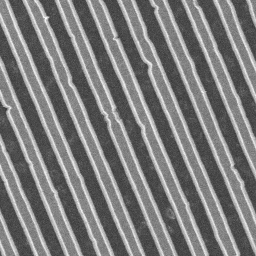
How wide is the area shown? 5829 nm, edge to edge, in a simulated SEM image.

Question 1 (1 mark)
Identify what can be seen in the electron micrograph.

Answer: parallel lines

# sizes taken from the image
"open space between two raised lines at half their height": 384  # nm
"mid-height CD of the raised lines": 271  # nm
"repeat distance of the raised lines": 666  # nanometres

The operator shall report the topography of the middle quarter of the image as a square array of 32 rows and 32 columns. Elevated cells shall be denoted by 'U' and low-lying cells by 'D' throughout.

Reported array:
DDDDDUUUDDDDDUUUDDDDDDUUDDDDDUUU
UDDDDUUUDDDDDUUUUDDDDDUUDDDDDUUU
UDDDDDUUUDDDDDUUUDDDDDUUUDDDDUUU
UDDDDDUUUDDDDDUUUDDDDDUUUDDDDDUU
UUDDDDDUUUDDDDDUUUDDDDUUUUDDDDUU
UUDDDDDUUUDDDDDUUUDDDDDUUUDDDDDU
UUUDDDDUUUUDDDDUUUUDDDDUUUDDDDDU
UUUDDDDDUUUDDDDDUUUDDDDDUUUDDDDD
UUUUDDDDUUUDDDDDUUUDDDDDUUUUDDDD
DUUUDDDDDUUUDDDDDUUUDDDDDUUUDDDD
DUUUDDDDDUUUDDDDDUUUDDDDDUUUDDDD
DUUUUDDDDUUUUDDDDUUUUDDDDUUUUDDD
DDUUUDDDDDUUUDDDDDUUUDDDDDUUUDDD
DDDUUUDDDDDUUDDDDDUUUDDDDDUUUDDD
DDDUUUDDDDDUUUDDDDDUUUDDDDDUUUDD
DDDUUUDDDDDUUUDDDDDDUUDDDDDUUUDD
DDDDUUUDDDDDUUUDDDDDUUUDDDDDUUUD
DDDDUUUDDDDDUUUDDDDDUUUDDDDDUUUD
DDDDDUUUDDDDUUUUDDDDUUUDDDDDUUUD
DDDDDUUUDDDDDUUUDDDDDUUUDDDDDUUU
UDDDDUUUUDDDDUUUUDDDDUUUDDDDDUUU
UDDDDDUUUDDDDDUUUDDDDUUUUDDDDDUU
UDDDDDUUUDDDDDUUUDDDDDUUUDDDDDUU
UUDDDDDUUUDDDDUUUUDDDDUUUUDDDDUU
UUDDDDDUUUDDDDDUUUDDDDDUUUDDDDDU
UUUDDDDDUUUDDDDUUUDDDDDUUUUDDDDU
UUUDDDDDUUUDDDDDUUUDDDDUUUUDDDDD
UUUUDDDDUUUDDDDDUUUDDDDDUUUDDDDD
DUUUDDDDDUUUDDDDDUUUDDDDDUUUDDDD
DUUUUDDDDUUUDDDDDUUUDDDDDUUUDDDD
DDUUUDDDDDUUUDDDDUUUUDDDDUUUDDDD
DDUUUDDDDDUUUDDDDDUUUDDDDDUUUDDD